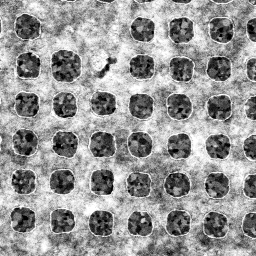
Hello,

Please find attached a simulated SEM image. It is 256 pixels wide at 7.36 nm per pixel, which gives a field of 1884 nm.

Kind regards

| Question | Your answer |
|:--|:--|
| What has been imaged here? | a regular array of raised bodies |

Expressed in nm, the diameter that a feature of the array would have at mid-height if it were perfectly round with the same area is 199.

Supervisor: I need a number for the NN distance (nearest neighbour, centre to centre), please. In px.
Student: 38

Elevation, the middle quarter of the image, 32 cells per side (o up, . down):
oooo............ooooooo...oooooo
oooo............ooooooo...oooooo
oooo.............oooooo...oooooo
oooo..............oooo.....ooooo
oo........oo....................
................................
..oo............................
oo.o...ooooo.....oooo......ooo..
ooo....oooooo...oooooo....ooooo.
ooo....oooooo...oooooo....oooooo
ooo....oooooo...oooooo....oooooo
ooo....oooooo...oooooo....oooooo
ooo...o.oooo.....ooooo....oooooo
o....oooo.........ooo......oooo.
................................
................................
................................
ooo....ooooo.....oooo.......ooo.
ooo....oooooo...oooooo....ooooo.
oooo..ooooooo...oooooo....oooooo
ooo...ooooooo...oooooo....oooooo
ooo....oooooo...oooooo....oooooo
ooo....oooooo....ooooo....oooooo
...........................oooo.
................................
................................
o.......ooo.....................
oo.....ooooo....ooooo.....oooo..
ooo....oooooo...oooooo...oooooo.
ooo....oooooo...oooooo...ooooooo
ooo....ooooo....oooooo...ooooooo
oo.....ooooo....oooooo...ooooooo